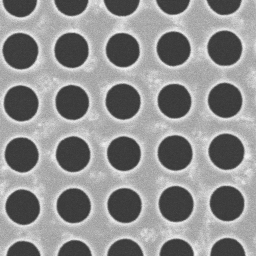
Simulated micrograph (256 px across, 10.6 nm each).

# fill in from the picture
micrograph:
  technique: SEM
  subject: a regular array of holes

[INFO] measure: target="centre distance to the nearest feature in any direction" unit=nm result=540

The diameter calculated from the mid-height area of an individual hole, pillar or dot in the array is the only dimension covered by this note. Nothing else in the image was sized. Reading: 377 nanometers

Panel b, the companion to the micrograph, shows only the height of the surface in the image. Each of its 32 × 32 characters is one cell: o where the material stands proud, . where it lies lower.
.....oo....oo....ooo....oo....oo
o...oooo..oooo...ooo...oooo..ooo
oooooooooooooooooooooooooooooooo
oooooooooooooooooooooooooooooooo
o...oooo..oooo...ooo...ooo....oo
.....oo....oo....ooo....oo....oo
.....oo....oo....ooo....oo....oo
o....oo....ooo...ooo...ooo....oo
oo..oooooooooooooooooooooooooooo
oooooooooooooooooooooooooooooooo
ooooooooooooooo.ooooo.ooooo..ooo
o...ooo....oo....ooo....oo....oo
o....oo....oo.....oo....oo....oo
o....oo....oo....ooo....oo....oo
o...oooo..oooo...oooo..oooo..ooo
oooooooooooooooooooooooooooooooo
oooooooooooooooooooooooooooooooo
o...oooo..oooo...ooo...oooo...oo
o....oo....oo....ooo....oo.....o
.....oo....oo.....oo....oo.....o
o....oo....ooo...ooo....ooo...oo
oo.oooooo.oooooooooooooooooooooo
oooooooooooooooooooooooooooooooo
ooooooooooooooo.ooooo..oooo..ooo
o....oo....ooo...ooo....oo....oo
o....oo....oo.....oo....oo.....o
o....oo....ooo....oo....oo....oo
o...oooo..oooo...oooo..ooooo.ooo
oooooooooooooooooooooooooooooooo
oooooooooooooooooooooooooooooooo
oo..oooo...ooo...ooo....ooo...oo
o....oo....oo.....oo....oo.....o